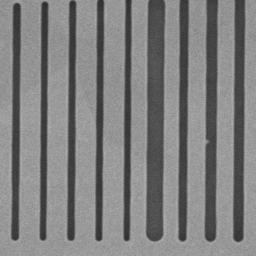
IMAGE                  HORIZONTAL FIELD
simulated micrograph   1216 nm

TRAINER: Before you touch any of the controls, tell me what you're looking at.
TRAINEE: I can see groups of lines, slits or small figures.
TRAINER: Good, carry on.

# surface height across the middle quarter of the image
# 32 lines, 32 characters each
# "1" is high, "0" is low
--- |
10011111001111100111100001111001
10011111001111100111100001111001
10011111001111100111100001111001
10011111001111100111100001111001
10011111001111100111100001111001
10011111001111100111100001111001
10011111001111100111100001111001
10011111001111100111100001111001
10011111001111100111100001111001
10011111001111100111100001111001
10011111001111100111100001111001
10011111001111100111100001111001
10011111001111100111100001111001
10011111001111100111100001111001
10011111001111100111100001111001
10011111001111100111100001111001
10011111001111100111100001111001
10011111001111100111100001111001
10011111001111100111100001111001
10011111001111100111100001111001
10011111001111100111100001111001
10011111001111100111100001111001
10011111001111100111000001111001
10011111001111100111000001111001
10011111001111100111000001111001
10011111001111100111000001111001
10011111001111100111000001111001
10011111001111100111000001111001
10011111001111100111000001111001
10011111001111100111000001111001
10011111001111100111000001111001
10011111001111100111000001111001